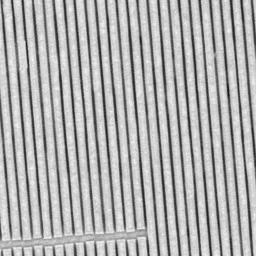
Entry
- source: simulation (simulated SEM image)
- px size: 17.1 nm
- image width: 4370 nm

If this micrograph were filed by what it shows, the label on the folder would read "parallel lines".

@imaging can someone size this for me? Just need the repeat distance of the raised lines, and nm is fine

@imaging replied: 177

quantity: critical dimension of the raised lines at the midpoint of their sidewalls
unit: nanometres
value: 128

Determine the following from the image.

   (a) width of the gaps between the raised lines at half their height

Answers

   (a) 44.6 nanometers